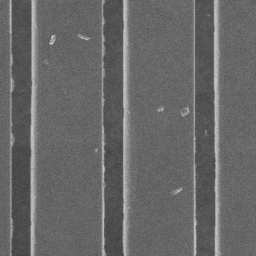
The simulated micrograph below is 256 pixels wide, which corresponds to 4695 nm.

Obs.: lines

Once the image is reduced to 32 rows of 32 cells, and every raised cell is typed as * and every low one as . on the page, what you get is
*...*********...********...*****
*...*********...********...*****
*...*********...********...*****
*...*********...********...*****
*...*********...********...*****
*...*********...********...*****
*...*********...********...*****
*...*********...********...*****
*...*********...********...*****
*...*********...********...*****
*...*********...********...*****
*...*********...********...*****
*...*********...********...*****
*...*********...********...*****
*...*********...********...*****
*...*********...********...*****
*...*********...********...*****
*...*********...********...*****
*...*********...********...*****
*...*********...********...*****
*...*********...********...*****
*...*********...********...*****
*...*********...********...*****
*...*********...********...*****
*...*********...********...*****
*...*********...********...*****
*...*********...********...*****
*...*********...********...*****
*...*********...********...*****
*...*********...********...*****
*...*********...********...*****
*...*********...********...*****